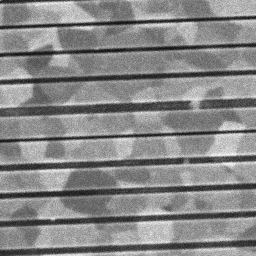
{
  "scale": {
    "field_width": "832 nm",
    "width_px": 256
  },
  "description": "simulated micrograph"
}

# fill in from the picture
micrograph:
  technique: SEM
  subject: parallel lines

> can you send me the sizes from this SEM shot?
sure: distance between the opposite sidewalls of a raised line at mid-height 0.0707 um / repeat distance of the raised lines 0.0914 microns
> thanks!